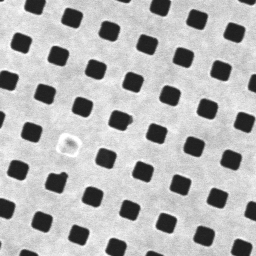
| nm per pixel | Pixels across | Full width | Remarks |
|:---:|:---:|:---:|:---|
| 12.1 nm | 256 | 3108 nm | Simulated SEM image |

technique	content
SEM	a regular array of holes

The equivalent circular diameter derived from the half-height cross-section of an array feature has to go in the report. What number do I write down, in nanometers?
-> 256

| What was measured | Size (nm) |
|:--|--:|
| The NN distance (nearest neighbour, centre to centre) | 477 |